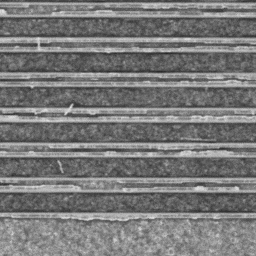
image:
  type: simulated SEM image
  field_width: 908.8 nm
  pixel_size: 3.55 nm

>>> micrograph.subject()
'parallel lines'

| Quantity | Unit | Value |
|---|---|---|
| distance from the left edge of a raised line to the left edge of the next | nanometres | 124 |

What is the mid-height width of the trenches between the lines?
0.0776 µm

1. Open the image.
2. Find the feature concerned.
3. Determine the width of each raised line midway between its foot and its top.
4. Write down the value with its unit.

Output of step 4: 0.0457 um